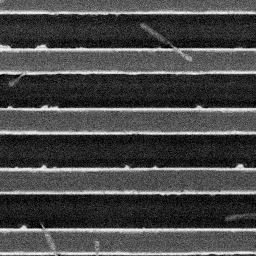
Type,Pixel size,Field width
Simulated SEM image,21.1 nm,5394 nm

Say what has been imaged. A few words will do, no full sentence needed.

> lines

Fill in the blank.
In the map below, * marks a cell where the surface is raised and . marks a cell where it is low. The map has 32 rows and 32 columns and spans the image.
********************************
********************************
................................
................................
................................
................................
********************************
********************************
********************************
................................
................................
................................
................................
................................
********************************
********************************
********************************
................................
................................
................................
................................
********************************
********************************
********************************
................................
................................
................................
................................
................................
********************************
********************************
********************************